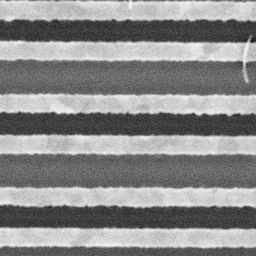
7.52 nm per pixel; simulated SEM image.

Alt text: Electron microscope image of lines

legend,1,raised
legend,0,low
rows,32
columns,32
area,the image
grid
11111111111111111111111111111111
11111111111111111111111111111111
11001110110111110110101110111011
00000000000000000000000000000000
00000000000000000000000000000000
11111111111111111111111111111111
11111111111111111111111111111111
00000000000001000000000001010111
00000000000000000000000000000000
00000000000000000000000000000000
00000000000000000000000000000000
00000000000000000000000000000000
11111111111111111111111111111111
11111111111111111111111111111111
00000000000000000000000000000000
00000000000000000000000000000000
00000000000000000000000000000000
11111111111111111111111111111111
11111111111111111111111111111111
00000000000000000000000000000000
00000000000000000000000000000000
00000000000000000000000000000000
00000000000000000000000000000000
01010000010000000001000000000000
11111111111111111111111111111111
11111111111111111111111111111111
00000000000000000000000000000000
00000000000000000000000000000000
00000000000000000000000000000000
11111111111111111111111111111111
11111111111111111111111111111111
00000000000000000000000000000000